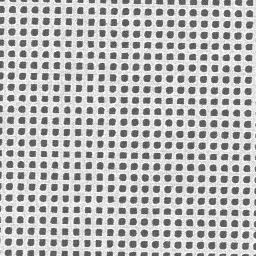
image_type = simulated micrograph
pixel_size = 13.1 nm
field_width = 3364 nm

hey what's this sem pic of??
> a regular array of holes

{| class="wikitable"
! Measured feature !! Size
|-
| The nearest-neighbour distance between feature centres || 143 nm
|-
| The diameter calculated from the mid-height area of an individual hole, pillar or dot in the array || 104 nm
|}